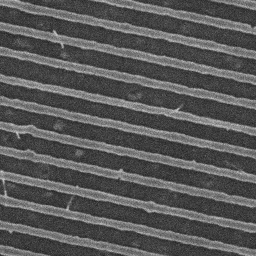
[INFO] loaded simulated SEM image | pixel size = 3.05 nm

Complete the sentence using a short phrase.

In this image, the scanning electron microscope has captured parallel lines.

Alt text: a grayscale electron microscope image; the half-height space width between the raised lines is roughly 51.4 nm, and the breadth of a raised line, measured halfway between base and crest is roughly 23.1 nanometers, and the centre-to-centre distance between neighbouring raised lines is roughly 73.9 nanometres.